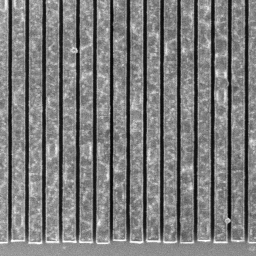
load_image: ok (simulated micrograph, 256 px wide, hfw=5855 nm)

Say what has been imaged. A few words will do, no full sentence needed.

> parallel lines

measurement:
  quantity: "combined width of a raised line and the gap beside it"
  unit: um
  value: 0.386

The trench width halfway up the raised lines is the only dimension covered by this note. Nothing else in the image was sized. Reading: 97.2 nm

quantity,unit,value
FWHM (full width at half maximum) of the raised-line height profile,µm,0.292